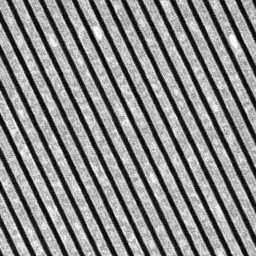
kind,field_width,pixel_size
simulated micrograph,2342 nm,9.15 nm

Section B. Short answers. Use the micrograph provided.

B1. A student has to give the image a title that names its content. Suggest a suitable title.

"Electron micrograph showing parallel lines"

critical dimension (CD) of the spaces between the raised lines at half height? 5.3 px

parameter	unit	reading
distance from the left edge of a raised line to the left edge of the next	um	0.135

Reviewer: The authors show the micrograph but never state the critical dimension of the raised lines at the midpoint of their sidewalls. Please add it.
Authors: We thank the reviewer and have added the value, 88.7 nm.